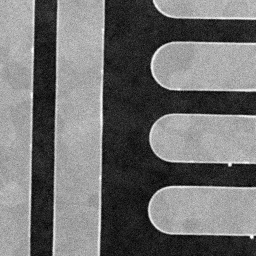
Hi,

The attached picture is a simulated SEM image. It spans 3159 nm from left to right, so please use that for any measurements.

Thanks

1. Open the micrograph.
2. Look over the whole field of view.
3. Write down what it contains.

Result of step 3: groups of lines, slits or small figures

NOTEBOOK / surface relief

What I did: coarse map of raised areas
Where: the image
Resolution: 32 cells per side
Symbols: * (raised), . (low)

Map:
****...******......*************
****...******.......************
****...******...................
****...******...................
****...******...................
****...******........***********
****...******.......************
****...******......*************
****...******......*************
****...******......*************
****...******.......************
****...******...................
****...******...................
****...******...................
****...******........********...
****...******......*************
****...******......*************
****...******......*************
****...******......*************
****...******.......************
****...******...................
****...******...................
****...******...................
****...******........*********..
****...******......*************
****...*****.......*************
****...*****.......*************
****...*****.......*************
****...*****........************
****...*****...................*
****...*****....................
****...*****....................